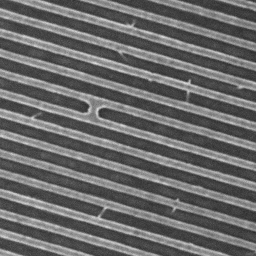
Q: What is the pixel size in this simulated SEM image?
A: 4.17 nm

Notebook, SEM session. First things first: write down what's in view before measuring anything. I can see parallel lines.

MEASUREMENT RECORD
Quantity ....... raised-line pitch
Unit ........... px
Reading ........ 19.2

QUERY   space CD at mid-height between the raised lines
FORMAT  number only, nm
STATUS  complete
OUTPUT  52.1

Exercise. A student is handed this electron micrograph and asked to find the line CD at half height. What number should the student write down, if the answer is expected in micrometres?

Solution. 0.028